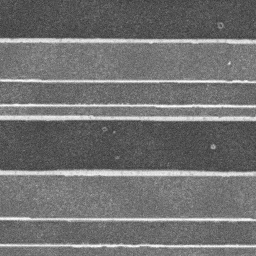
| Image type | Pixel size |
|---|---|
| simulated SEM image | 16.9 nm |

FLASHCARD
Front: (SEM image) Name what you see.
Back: lines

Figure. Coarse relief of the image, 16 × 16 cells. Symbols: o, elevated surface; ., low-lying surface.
................
................
................
oooooooooooooooo
oooooooooooooooo
oooooooooooooooo
oooooooooooooooo
................
................
................
................
oooooooooooooooo
oooooooooooooooo
oooooooooooooooo
oooooooooooooooo
oooooooooooooooo